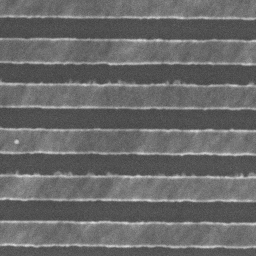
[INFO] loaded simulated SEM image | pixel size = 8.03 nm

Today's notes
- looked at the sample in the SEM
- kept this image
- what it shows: lines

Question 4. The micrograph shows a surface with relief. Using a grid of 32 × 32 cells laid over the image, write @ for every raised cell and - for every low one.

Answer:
@@@@@@@@@@@@@@@@@@@@@@@@@@@@@@@@
@@@@@@@@@@@@@@@@@@@@@@@@@@@@@@@@
--------------------------------
--------------------------------
--------------------------------
@@@@@@@@@@@@@@@@@@@@@@@@@@@@@@@@
@@@@@@@@@@@@@@@@@@@@@@@@@@@@@@@@
@@@@@@@@@@@@@@@@@@@@@@@@@@@@@@@@
--------------------------------
--------------------------------
@@@--@---@----------------------
@@@@@@@@@@@@@@@@@@@@@@@@@@@@@@@@
@@@@@@@@@@@@@@@@@@@@@@@@@@@@@@@@
--------------@-@@@@@@@@@@@@@@@@
--------------------------------
--------------------------------
@@@@@@@@@@@@@@@@@@@@@@@@@@@@@@@@
@@@@@@@@@@@@@@@@@@@@@@@@@@@@@@@@
@@@@@@@@@@@@@@@@@@@@@@@@@@@@@@@@
--------------------------------
--------------------------------
--------------------------------
@@@@@@@@@@@@@@@@@@@@@@@@@@@@@@@@
@@@@@@@@@@@@@@@@@@@@@@@@@@@@@@@@
@@@@@@@@@@@@@@@@@@@@@@@@@@@@@@@@
--------------------------------
--------------------------------
--------------------------------
@@@@@@@@@@@@@@@@@@@@@@@@@@@@@@@@
@@@@@@@@@@@@@@@@@@@@@@@@@@@@@@@@
@@@@@@@@@@@@@@@@@@@@@@@@@@@@@@@@
--------------------------------